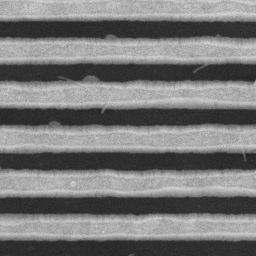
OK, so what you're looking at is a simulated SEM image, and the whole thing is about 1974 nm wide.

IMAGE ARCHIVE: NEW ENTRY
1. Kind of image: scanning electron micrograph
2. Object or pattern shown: lines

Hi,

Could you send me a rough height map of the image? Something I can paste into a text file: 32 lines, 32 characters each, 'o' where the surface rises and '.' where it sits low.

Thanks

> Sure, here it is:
oooooooooooooooooooooooooooooooo
oooooooooooooooooooooooooooooooo
................................
................................
................................
oooooooooooooooooooooooooooooooo
oooooooooooooooooooooooooooooooo
oooooooooooooooooooooooooooooooo
................................
................................
o........oooo....o.....o..oooo.o
oooooooooooooooooooooooooooooooo
oooooooooooooooooooooooooooooooo
................................
................................
................................
oooooooooooooooooooooooooooooooo
oooooooooooooooooooooooooooooooo
oooooooooooooooooooooooooooooooo
................................
................................
.............o..................
oooooooooooooooooooooooooooooooo
oooooooooooooooooooooooooooooooo
................................
................................
................................
oooooooooooooooooooooooooooooooo
oooooooooooooooooooooooooooooooo
oooooooooooooooooooooooooooooooo
................................
................................